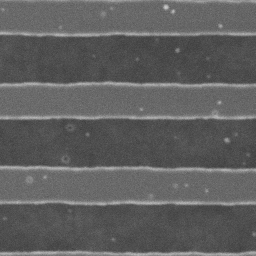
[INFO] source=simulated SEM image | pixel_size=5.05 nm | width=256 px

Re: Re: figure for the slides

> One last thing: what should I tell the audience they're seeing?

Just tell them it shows lines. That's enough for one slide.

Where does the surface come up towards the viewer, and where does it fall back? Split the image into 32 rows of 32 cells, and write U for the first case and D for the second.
UUUUUUUUUUUUUUUUUUUUUUUUUUUUUUUU
UUUUUUUUUUUUUUUUUUUUUUUUUUUUUUUU
UUUUUUUUUUUUUUUUUUUUUUUUUUUUUUUU
UUUUUUUUUUUUUUUUUUUUUUUUUUUUUUUU
DDDDDDDDDDDDDDDDDDDDDDDDDDDDDDDD
DDDDDDDDDDDDDDDDDDDDDDDDDDDDDDDD
DDDDDDDDDDDDDDDDDDDDDDDDDDDDDDDD
DDDDDDDDDDDDDDDDDDDDDDDDDDDDDDDD
DDDDDDDDDDDDDDDDDDDDDDDDDDDDDDDD
DDDDDDDDDDDDDDDDDDDDDDDDDDDDDDDD
UUUUUUUDUUUUUUUUUUUUUUUDDDUUUDDD
UUUUUUUUUUUUUUUUUUUUUUUUUUUUUUUU
UUUUUUUUUUUUUUUUUUUUUUUUUUUUUUUU
UUUUUUUUUUUUUUUUUUUUUUUUUUUUUUUU
UUUUUUUUUUUUUUUUUUUUUUUUUUUUUUUU
DDDDDDDDDDDDDDDDDDDDDDDDDDDDDDDD
DDDDDDDDDDDDDDDDDDDDDDDDDDDDDDDD
DDDDDDDDDDDDDDDDDDDDDDDDDDDDDDDD
DDDDDDDDDDDDDDDDDDDDDDDDDDDDDDDD
DDDDDDDDDDDDDDDDDDDDDDDDDDDDDDDD
DDDDDDDDDDDDDDDDDDDDDDDDDDDDDDDD
UUUUUUUUUUUUUUUUUUUUUUUUUUUUUUUU
UUUUUUUUUUUUUUUUUUUUUUUUUUUUUUUU
UUUUUUUUUUUUUUUUUUUUUUUUUUUUUUUU
UUUUUUUUUUUUUUUUUUUUUUUUUUUUUUUU
DDDDDDDDDDUDUUDDDDDDDDDDDDDUUUDD
DDDDDDDDDDDDDDDDDDDDDDDDDDDDDDDD
DDDDDDDDDDDDDDDDDDDDDDDDDDDDDDDD
DDDDDDDDDDDDDDDDDDDDDDDDDDDDDDDD
DDDDDDDDDDDDDDDDDDDDDDDDDDDDDDDD
DDDDDDDDDDDDDDDDDDDDDDDDDDDDDDDD
DDDDDDDDDDDDDDDDDDDDDDDDDDDDDDDD